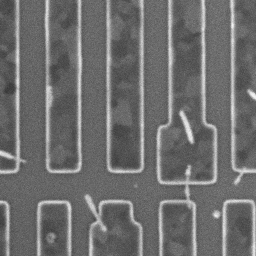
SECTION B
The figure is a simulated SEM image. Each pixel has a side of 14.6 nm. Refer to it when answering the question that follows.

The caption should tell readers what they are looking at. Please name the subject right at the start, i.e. wiring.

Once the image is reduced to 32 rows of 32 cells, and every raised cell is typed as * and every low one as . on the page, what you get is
**....****...*****...****....***
**....****...*****...****....***
**....****...*****...****....***
**....****...*****...****....***
**....****...*****...****....***
**....****...*****...****....***
**....****...*****...****....***
**....****...*****...****....***
**....****...*****...****....***
**....****...*****...****....***
**....****...*****...*****...***
**....****...*****...*****...***
**....****...*****...*****...***
**....****...*****...*****...***
**....****...*****...*****...***
**....****...*****...*****...***
**....****...*****..*******..***
**....****...*****..*******..***
**....****...*****..*******..***
**....****...*****..*******..***
**....****...*****..*******..***
....................*******...*.
....................*******.....
................................
................................
*....***.....***....****....****
*....****...****....****....****
*....****...*****...****....****
*....****..*******..****....****
*....****..*******..****....****
*....****..*******..****....****
*....****..*******..****....****